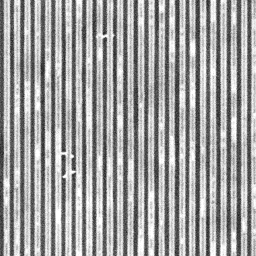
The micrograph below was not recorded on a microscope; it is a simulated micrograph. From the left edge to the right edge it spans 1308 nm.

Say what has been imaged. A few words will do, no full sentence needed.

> parallel lines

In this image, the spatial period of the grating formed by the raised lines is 0.0526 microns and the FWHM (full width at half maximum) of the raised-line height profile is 24.9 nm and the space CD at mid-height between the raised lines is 24.9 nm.